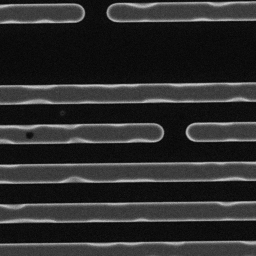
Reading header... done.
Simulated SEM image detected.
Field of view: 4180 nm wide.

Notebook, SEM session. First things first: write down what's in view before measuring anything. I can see groups of lines, slits or small figures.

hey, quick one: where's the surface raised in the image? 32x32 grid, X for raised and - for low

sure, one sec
--------------XX---XXXXXXXX-XXXX
XXXXXXXXXXX--XXXXXXXXXXXXXXXXXXX
XXXXXXXXXX----XXXXXXXXXXXXXXXXXX
--------------------------------
--------------------------------
--------------------------------
--------------------------------
--------------------------------
--------------------------------
--------------------------------
-------------------XXX---XXXXXXX
XXXXXXXXXXXXXXXXXXXXXXXXXXXXXXXX
XXXXXXXXXXXXXXXXXXXXXXXXXXXXXXXX
--------------------------------
--------------------------------
-------------------------XXXXXXX
XXXXXXXXXXXXXXXXXXXX---XXXXXXXXX
XXXXXXXXXXXXXXXXXXXX----XXXXXXXX
--------------------------------
--------------------------------
--------------XXXXXXXXXXXXXXXXXX
XXXXXXXXXXXXXXXXXXXXXXXXXXXXXXXX
XXXXXXXXX-XXXXXXXXXXXXXXXXXX---X
--------------------------------
--------------------------------
-------XXXXXXXXXXXXXXXXXXXXXXXXX
XXXXXXXXXXXXXXXXXXXXXXXXXXXXXXXX
XXXXXXXXXXXXXXXXXXXXXXXXXX------
--------------------------------
--------------------------------
XXXXXXXXXXXX-XXXXXXXXXXXXXXXXXXX
XXXXXXXXXXXXXXXXXXXXXXXXXXXXXXXX